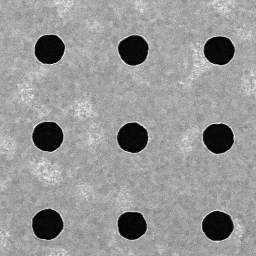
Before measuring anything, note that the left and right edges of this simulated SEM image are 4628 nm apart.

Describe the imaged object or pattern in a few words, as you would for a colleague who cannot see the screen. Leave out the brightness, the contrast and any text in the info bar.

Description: a regular array of holes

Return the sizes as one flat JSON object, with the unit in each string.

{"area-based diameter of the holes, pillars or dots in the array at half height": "547 nm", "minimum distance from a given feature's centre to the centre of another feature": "1530 nm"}